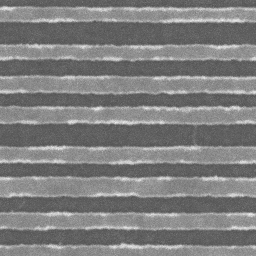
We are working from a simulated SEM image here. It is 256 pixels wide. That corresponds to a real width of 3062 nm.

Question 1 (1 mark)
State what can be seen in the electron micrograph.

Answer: parallel lines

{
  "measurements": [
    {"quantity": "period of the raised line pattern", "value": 34.4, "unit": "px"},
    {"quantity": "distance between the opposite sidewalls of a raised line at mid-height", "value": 191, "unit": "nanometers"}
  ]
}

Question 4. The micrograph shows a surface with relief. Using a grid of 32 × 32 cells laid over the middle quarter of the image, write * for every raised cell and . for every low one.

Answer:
................................
................................
................................
****************.***************
********************************
********************************
********************************
................................
................................
................................
................................
********************************
********************************
********************************
***..***************************
................................
................................
................................
................................
................................
................................
********************************
********************************
********************************
*************************.******
................................
................................
................................
*****..*.**.****....***********.
********************************
********************************
********************************